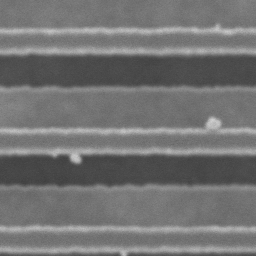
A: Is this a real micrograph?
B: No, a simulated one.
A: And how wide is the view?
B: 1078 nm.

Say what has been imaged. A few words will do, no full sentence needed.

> lines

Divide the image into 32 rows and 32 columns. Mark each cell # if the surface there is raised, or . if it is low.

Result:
################################
################################
################################
################################
################################
################################
################################
................................
................................
................................
................................
################################
################################
################################
################################
################################
################################
################################
################################
.........#......................
................................
................................
................................
################################
################################
################################
################################
################################
################################
################################
################################
......#........#................